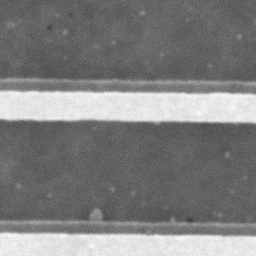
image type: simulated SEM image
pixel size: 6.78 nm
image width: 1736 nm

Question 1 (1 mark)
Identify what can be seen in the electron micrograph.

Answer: lines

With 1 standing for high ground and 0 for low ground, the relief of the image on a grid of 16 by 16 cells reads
0000000000000000
0000000000000000
0000000000000000
0000000000000000
0000000000000000
1111111111111111
1111111111111111
0000000111111111
0000000000000000
0000000000000000
0000000000000000
0000000000000000
0000000000000000
0000000000000000
1111111111111111
1111111111111111